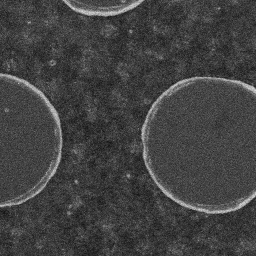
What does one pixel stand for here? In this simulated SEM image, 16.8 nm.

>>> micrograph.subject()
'raised bodies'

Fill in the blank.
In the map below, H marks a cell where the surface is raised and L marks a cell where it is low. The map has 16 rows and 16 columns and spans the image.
LLLLLHHHLLLLLLLL
LLLLLLLLLLLLLLLL
LLLLLLLLLLLLLLLL
LLLLLLLLLLLLLLLL
LLLLLLLLLLLLLLLL
HHLLLLLLLLLHHHHH
HHHLLLLLLLHHHHHH
HHHHLLLLLHHHHHHH
HHHHLLLLLHHHHHHH
HHHHLLLLLHHHHHHH
HHHHLLLLLHHHHHHH
HHHLLLLLLLHHHHHH
HHLLLLLLLLLHHHHH
LLLLLLLLLLLLLLLL
LLLLLLLLLLLLLLLL
LLLLLLLLLLLLLLLL